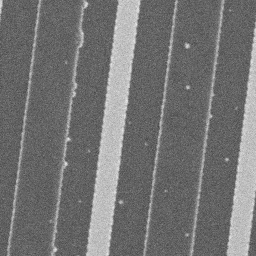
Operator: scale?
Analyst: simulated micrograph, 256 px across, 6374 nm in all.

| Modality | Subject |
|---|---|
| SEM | lines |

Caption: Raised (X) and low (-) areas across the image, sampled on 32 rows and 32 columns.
-----XXXXXX----XX-----XXXXXX----
-----XXXXX-----XX-----XXXXXX----
-----XXXXX-----XX-----XXXXXX----
----XXXXXX----XXX-----XXXXXX----
----XXXXXX----XXX----XXXXXX-----
----XXXXXX----XXX----XXXXXX-----
----XXXXXX----XXX----XXXXXX-----
----XXXXXX----XXX----XXXXXX----X
----XXXXXX----XX-----XXXXXX----X
----XXXXX-----XX-----XXXXXX----X
----XXXXX----XXX-----XXXXXX----X
----XXXXX----XXX-----XXXXXX----X
---XXXXXX----XXX----XXXXXX-----X
---XXXXXX----XXX----XXXXXX-----X
---XXXXXX----XXX----XXXXXX-----X
---XXXXXX----XXX----XXXXXX----XX
---XXXXX-----XX-----XXXXXX----XX
---XXXXX-----XX-----XXXXXX----XX
---XXXXX----XXX-----XXXXXX----XX
--XXXXXX----XXX----XXXXXX-----XX
--XXXXXX----XXX----XXXXXX-----XX
--XXXXXX----XXX----XXXXXX-----XX
--XXXXXX----XXX----XXXXXX----XXX
--XXXXXX----XX-----XXXXXX----XXX
--XXXXXX----XX-----XXXXXX----XXX
--XXXXX-----XX-----XXXXXX----XXX
--XXXXX-----XX-----XXXXXX----XXX
--XXXXX----XXX-----XXXXXX----XX-
-XXXXXX----XXX----XXXXXX-----XX-
-XXXXXX----XXX----XXXXXX-----XX-
-XXXXXX----XXX----XXXXXX-----XX-
-XXXXXX----XXX----XXXXXX----XXX-